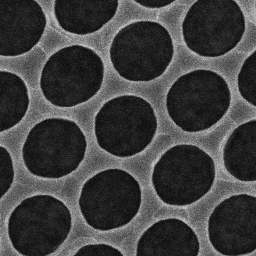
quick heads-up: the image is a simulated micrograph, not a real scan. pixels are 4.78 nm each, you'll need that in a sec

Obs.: holes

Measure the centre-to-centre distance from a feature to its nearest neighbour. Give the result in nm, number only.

355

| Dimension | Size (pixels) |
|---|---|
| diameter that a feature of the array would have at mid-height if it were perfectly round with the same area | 62.3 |